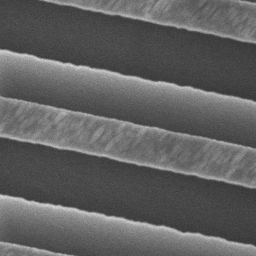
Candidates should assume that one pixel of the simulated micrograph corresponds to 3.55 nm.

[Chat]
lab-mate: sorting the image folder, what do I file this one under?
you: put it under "lines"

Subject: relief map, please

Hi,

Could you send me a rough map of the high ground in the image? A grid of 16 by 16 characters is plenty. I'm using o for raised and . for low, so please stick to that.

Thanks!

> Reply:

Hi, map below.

.....ooooooooooo
..........oooooo
...............o
oo..............
ooooooo.........
oooooooooooo....
oooooooooooooooo
oooooooooooooooo
oooooooooooooooo
.....ooooooooooo
..........oooooo
...............o
oo..............
ooooooo.........
ooooooooooo.....
oooooooooooooooo